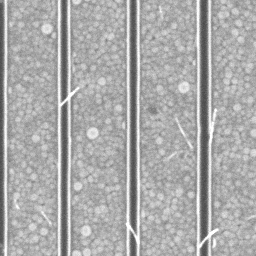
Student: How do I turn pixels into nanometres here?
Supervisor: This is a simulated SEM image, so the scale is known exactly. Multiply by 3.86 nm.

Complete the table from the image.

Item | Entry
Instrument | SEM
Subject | one or a few lines or trenches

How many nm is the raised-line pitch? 270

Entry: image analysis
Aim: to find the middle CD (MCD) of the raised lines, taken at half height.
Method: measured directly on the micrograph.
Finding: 11.2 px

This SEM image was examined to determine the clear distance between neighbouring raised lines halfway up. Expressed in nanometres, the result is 224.